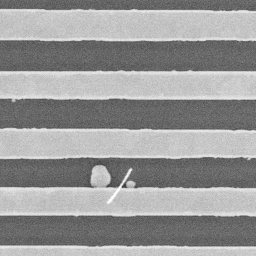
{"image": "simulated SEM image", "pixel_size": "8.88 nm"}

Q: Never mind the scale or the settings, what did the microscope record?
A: lines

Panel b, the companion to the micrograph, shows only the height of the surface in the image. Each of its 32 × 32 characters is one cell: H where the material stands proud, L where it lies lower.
LLLLLLLLLLLLLLLLLLLLLLLLLLLLLLLL
HHHHHHHHHHHHHHHHHHHHHHHHHHHHHHHH
HHHHHHHHHHHHHHHHHHHHHHHHHHHHHHHH
HHHHHHHHHHHHHHHHHHHHHHHHHHHHHHHH
HHHHHHHHHHHHHHHHHHHHHHHHHHHHHHHH
LLLLLLLLLLLLLLLLLLLLLLLLLLLLLLLL
LLLLLLLLLLLLLLLLLLLLLLLLLLLLLLLL
LLLLLLLLLLLLLLLLLLLLLLLLLLLLLLLL
LLLLLLLLLLLLLLLLLLLLLLLLLLLLLLLL
HHHHHHHHHHHHHHHHHHHHHHHHHHHHHHHH
HHHHHHHHHHHHHHHHHHHHHHHHHHHHHHHH
HHHHHHHHHHHHHHHHHHHHHHHHHHHHHHHH
LLLLLLLLLLLLLLLLLLLLLLLLLLLLLLLL
LLLLLLLLLLLLLLLLLLLLLLLLLLLLLLLL
LLLLLLLLLLLLLLLLLLLLLLLLLLLLLLLL
LLLLLLLLLLLLLLLLLLLLLLLLLLLLLLLL
HHHHHHHHHHHHHHHHHHHHHHHHHHHHHHHH
HHHHHHHHHHHHHHHHHHHHHHHHHHHHHHHH
HHHHHHHHHHHHHHHHHHHHHHHHHHHHHHHH
HHHHHHHHHHHHHHHHHHHHHHHHHHHHHHHH
LLLLLLLLLLLLLLLLLLLLLLLLLLLLLLLL
LLLLLLLLLLLLLLLLLLLLLLLLLLLLLLLL
LLLLLLLLLLLLHLLLLLLLLLLLLLLLLLLL
HHHHHLHHHHHLHHHHLLHLLLLLLLLHLLLL
HHHHHHHHHHHHHHHHHHHHHHHHHHHHHHHH
HHHHHHHHHHHHHHHHHHHHHHHHHHHHHHHH
HHHHHHHHHHHHHHHHHHHHHHHHHHHHHHHH
LLLLLLLLLLLLLLLLLLLLLLLLLLLLLLLL
LLLLLLLLLLLLLLLLLLLLLLLLLLLLLLLL
LLLLLLLLLLLLLLLLLLLLLLLLLLLLLLLL
LLLLLLLLLLLLLLLLLLLLLLLLLLLLLLLL
HHHHHHHHHHHHHHHHHHHHHHHHHHHHHHHH